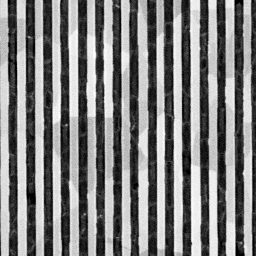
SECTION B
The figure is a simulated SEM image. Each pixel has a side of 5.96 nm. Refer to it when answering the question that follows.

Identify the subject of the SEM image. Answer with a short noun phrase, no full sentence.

parallel lines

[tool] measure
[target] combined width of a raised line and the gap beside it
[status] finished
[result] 104 nanometres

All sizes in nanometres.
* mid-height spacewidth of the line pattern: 56.6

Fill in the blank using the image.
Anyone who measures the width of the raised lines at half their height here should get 7.62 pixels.